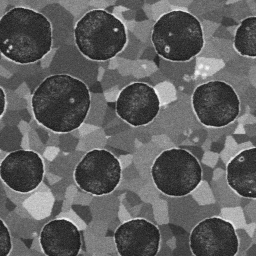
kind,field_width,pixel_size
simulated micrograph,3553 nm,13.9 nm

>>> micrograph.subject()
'holes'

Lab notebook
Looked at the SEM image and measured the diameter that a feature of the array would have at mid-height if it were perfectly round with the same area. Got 674 nm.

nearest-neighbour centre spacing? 1070 nm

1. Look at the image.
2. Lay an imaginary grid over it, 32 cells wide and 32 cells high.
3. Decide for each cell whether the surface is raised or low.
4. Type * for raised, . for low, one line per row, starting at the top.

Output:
********************************
*...*******...*******..*********
......****.....*****.....*****..
......***.......***......*****..
......***.......***......****...
......****......***......****...
......****.....*****.....*****..
*....*******.********...********
********************************
*******..***********************
*****.....******..********..****
.***.......****....*****.....***
.***.......****.....****......**
.***.......****.....****......**
****.......****....******.....**
*****.....******..*******...****
*******..***********************
********************************
********************************
*....******...******....*****...
.....*****.....****......****...
.....****......****......***....
.....****......****......***....
*...******....******....*****...
******************************..
********************************
********************************
*******.********..********..****
.****.....*****.....****.....***
.****.....****......****......**
.****.....*****.....****......**
.*****....*****.....****.....***